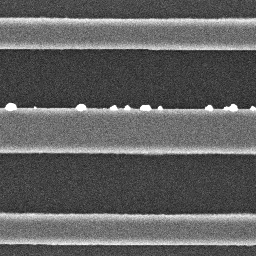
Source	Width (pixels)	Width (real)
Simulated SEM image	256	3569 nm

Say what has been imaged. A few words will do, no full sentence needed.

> lines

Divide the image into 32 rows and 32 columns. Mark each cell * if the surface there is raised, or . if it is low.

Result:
................................
................................
***********.***.................
********************************
********************************
********************************
................................
................................
................................
................................
................................
................................
................................
**..*....**...**.**.......*.**.*
********************************
********************************
********************************
********************************
********************************
................................
................................
................................
................................
................................
................................
................................
................................
********************************
********************************
********************************
.......*.**.********************
................................